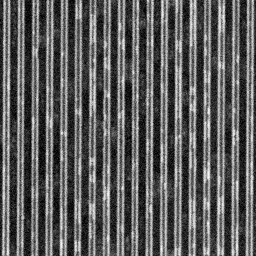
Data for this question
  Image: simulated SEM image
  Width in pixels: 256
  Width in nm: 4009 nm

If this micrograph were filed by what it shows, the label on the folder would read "parallel lines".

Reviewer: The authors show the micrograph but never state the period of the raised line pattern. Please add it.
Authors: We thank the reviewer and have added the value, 0.224 um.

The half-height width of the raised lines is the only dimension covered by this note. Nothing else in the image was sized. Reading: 76.4 nanometres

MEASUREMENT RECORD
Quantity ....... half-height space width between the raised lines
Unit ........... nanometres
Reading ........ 137